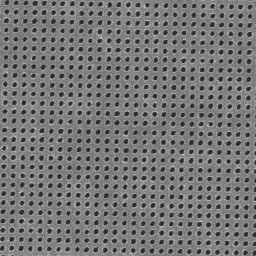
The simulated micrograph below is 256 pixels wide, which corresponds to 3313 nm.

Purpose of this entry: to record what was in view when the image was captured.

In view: a regular array of holes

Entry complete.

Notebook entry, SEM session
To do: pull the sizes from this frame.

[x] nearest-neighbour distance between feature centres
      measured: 0.113 microns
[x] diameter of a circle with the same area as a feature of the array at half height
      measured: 4.79 pixels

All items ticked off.